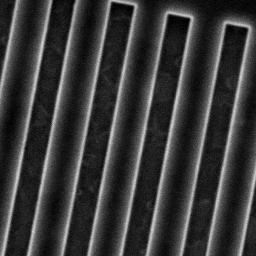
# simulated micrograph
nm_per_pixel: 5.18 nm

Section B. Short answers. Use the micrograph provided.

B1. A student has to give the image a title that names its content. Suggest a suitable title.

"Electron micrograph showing parallel lines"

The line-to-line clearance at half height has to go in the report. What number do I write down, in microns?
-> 0.129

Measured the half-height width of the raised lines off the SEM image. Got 178 nanometers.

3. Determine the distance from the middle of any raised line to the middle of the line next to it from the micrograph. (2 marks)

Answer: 302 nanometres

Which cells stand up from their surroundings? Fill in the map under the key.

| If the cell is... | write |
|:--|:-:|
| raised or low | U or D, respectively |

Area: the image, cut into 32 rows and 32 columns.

DDUUUUDDDUUUUUDDUUUUUUUUUUUUUUUU
DDUUUUDDDUUUUUDDDUUUUUUUUUUUUUUU
DDUUUUDDDUUUUDDDDUUUUDDDUUUUUUUU
DUUUUUDDDUUUUDDDUUUUUDDDUUUUDDDU
DUUUUUDDDUUUUDDDUUUUDDDDUUUUDDDU
DUUUUDDDDUUUUDDDUUUUDDDUUUUUDDDU
DUUUUDDDUUUUUDDDUUUUDDDUUUUDDDDU
DUUUUDDDUUUUDDDDUUUUDDDUUUUDDDUU
DUUUUDDDUUUUDDDUUUUUDDDUUUUDDDUU
UUUUUDDDUUUUDDDUUUUDDDDUUUUDDDUU
UUUUUDDDUUUUDDDUUUUDDDUUUUUDDDUU
UUUUDDDUUUUUDDDUUUUDDDUUUUUDDDUU
UUUUDDDUUUUUDDDUUUUDDDUUUUDDDDUU
UUUUDDDUUUUDDDDUUUUDDDUUUUDDDUUU
UUUUDDDUUUUDDDUUUUDDDDUUUUDDDUUU
UUUUDDDUUUUDDDUUUUDDDUUUUUDDDUUU
UUUDDDUUUUUDDDUUUUDDDUUUUUDDDUUU
UUUDDDUUUUUDDDUUUUDDDUUUUDDDDUUU
UUUDDDUUUUDDDDUUUUDDDUUUUDDDUUUU
UUUDDDUUUUDDDUUUUUDDDUUUUDDDUUUU
UUUDDDUUUUDDDUUUUDDDUUUUUDDDUUUU
UUDDDUUUUUDDDUUUUDDDUUUUUDDDUUUU
UUDDDUUUUUDDDUUUUDDDUUUUDDDDUUUU
UUDDDUUUUDDDDUUUUDDDUUUUDDDUUUUU
UUDDDUUUUDDDUUUUUDDDUUUUDDDUUUUD
UUDDDUUUUDDDUUUUDDDDUUUUDDDUUUUD
UDDDDUUUUDDDUUUUDDDUUUUUDDDUUUUD
UDDDUUUUUDDDUUUUDDDUUUUUDDDUUUUD
UDDDUUUUUDDDUUUUDDDUUUUDDDUUUUUD
UDDDUUUUDDDUUUUUDDDUUUUDDDUUUUUD
UDDDUUUUDDDUUUUDDDDUUUUDDDUUUUDD
UDDDUUUUDDDUUUUDDDUUUUUDDDUUUUDD